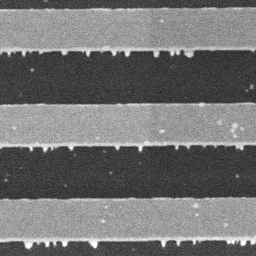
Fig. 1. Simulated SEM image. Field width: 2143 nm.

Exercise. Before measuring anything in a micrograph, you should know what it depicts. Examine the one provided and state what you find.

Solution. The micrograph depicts lines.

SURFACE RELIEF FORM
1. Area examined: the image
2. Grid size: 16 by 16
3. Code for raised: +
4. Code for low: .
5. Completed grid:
................
++++++++++++++++
++++++++++++++++
................
................
................
............+.++
++++++++++++++++
++++++++++++++++
................
................
................
++++++++++++++++
++++++++++++++++
++++++++++++++++
................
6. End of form